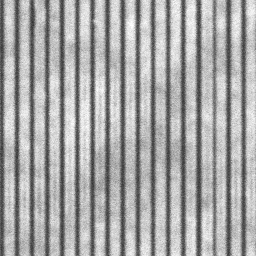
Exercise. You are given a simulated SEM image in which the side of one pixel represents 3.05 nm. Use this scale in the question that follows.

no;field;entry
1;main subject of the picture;parallel lines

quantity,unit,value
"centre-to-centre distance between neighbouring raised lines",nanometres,46.1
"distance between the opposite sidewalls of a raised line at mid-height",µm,0.0297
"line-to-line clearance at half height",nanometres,16.4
